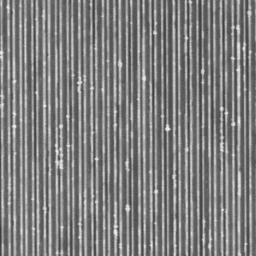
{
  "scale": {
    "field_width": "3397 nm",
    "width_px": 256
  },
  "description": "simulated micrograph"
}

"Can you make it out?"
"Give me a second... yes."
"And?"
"parallel lines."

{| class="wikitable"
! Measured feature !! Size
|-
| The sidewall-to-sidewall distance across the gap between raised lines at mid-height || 0.058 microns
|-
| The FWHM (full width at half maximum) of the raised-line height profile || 23.2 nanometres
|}